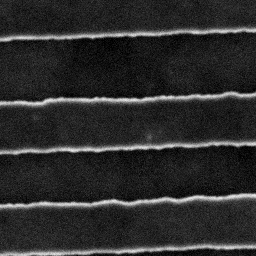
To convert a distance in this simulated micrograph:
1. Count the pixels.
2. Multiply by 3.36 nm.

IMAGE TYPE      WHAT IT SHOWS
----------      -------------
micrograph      lines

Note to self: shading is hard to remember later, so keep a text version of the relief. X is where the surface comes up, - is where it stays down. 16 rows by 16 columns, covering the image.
XXXXXXXXXXXXXXXX
XXXXXXXXXXXXXXXX
X---------------
----------------
----------------
----------------
XXXXXXXXXXXXXXXX
XXXXXXXXXXXXXXXX
XXXXXXXXXXXXXXXX
XXX-------------
----------------
----------------
---------XXXXXXX
XXXXXXXXXXXXXXXX
XXXXXXXXXXXXXXXX
XXXXXXXXXXXX-XX-